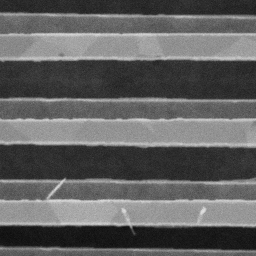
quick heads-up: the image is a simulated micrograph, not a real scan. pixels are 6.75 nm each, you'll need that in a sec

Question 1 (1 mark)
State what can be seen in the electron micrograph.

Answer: lines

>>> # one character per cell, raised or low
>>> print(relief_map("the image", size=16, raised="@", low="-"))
----------------
@@@@@@@@@@@@@@@@
@@@@@@@@@@@@@@@@
@@@@@@@@@@@@@@@@
----------------
----------------
@@@@@@@@@@@@@@@@
@@@@@@@@@@@@@@@@
@@@@@@@@@@@@@@@@
----------------
----------------
@@@@@@@@@@@@@@@@
@@@@@@@@@@@@@@@@
@@@@@@@@@@@@@@@@
----------------
@---------------